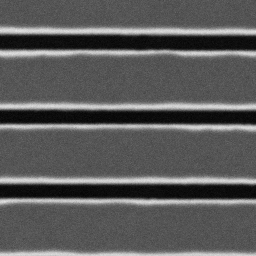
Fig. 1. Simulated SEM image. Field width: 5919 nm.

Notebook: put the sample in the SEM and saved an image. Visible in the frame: lines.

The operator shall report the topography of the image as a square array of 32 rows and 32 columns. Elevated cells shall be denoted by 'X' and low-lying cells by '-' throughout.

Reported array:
XXXXXXXXXXXXXXXXXXXXXXXXXXXXXXXX
XXXXXXXXXXXXXXXXXXXXXXXXXXXXXXXX
XXXXXXXXXXXXXXXXXXXXXXXXXXXXXXXX
XXXXXXXXXXXXXXXXXXXXXXXXXXXXXXXX
--------------------------------
--------------------------------
XXXXXXXXXXXXXXXXXXXXXXX-XXXXX---
XXXXXXXXXXXXXXXXXXXXXXXXXXXXXXXX
XXXXXXXXXXXXXXXXXXXXXXXXXXXXXXXX
XXXXXXXXXXXXXXXXXXXXXXXXXXXXXXXX
XXXXXXXXXXXXXXXXXXXXXXXXXXXXXXXX
XXXXXXXXXXXXXXXXXXXXXXXXXXXXXXXX
XXXXXXXXXXXXXXXXXXXXXXXXXXXXXXXX
XXXXXXXXXXXXXXXXXXXXXXXXXXXXXXXX
--------------------------------
--------------------------------
XXXXXXXXXXXXXXXXXXXXXXXXXXXXXXXX
XXXXXXXXXXXXXXXXXXXXXXXXXXXXXXXX
XXXXXXXXXXXXXXXXXXXXXXXXXXXXXXXX
XXXXXXXXXXXXXXXXXXXXXXXXXXXXXXXX
XXXXXXXXXXXXXXXXXXXXXXXXXXXXXXXX
XXXXXXXXXXXXXXXXXXXXXXXXXXXXXXXX
XXXXXXXXXXXXXXXXXXXXXXXXXXXXXXXX
--------------------------------
--------------------------------
XXXXXXXXXXXXXXXXXXXXXXXXXXXXXXXX
XXXXXXXXXXXXXXXXXXXXXXXXXXXXXXXX
XXXXXXXXXXXXXXXXXXXXXXXXXXXXXXXX
XXXXXXXXXXXXXXXXXXXXXXXXXXXXXXXX
XXXXXXXXXXXXXXXXXXXXXXXXXXXXXXXX
XXXXXXXXXXXXXXXXXXXXXXXXXXXXXXXX
XXXXXXXXXXXXXXXXXXXXXXXXXXXXXXXX